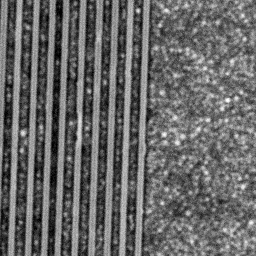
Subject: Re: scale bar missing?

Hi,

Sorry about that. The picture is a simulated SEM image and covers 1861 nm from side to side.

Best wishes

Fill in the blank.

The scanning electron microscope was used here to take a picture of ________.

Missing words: parallel lines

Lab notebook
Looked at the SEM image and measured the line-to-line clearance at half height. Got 10.4 pixels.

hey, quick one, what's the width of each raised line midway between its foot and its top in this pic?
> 38.1 nm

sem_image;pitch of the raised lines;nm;115